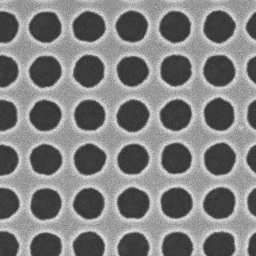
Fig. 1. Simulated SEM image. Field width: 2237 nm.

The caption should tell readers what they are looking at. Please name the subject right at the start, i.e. a regular array of holes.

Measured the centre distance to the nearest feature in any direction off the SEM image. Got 43.3 pixels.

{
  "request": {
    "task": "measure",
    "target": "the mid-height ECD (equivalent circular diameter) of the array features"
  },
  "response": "283 nanometers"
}